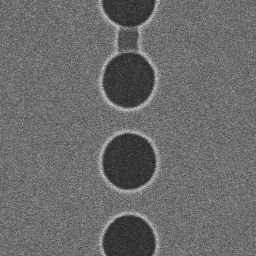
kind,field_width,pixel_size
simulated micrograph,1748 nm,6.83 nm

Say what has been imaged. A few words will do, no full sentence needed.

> holes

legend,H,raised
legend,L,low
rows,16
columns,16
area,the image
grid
HHHHHHLLLLHHHHHH
HHHHHHHLLHHHHHHH
HHHHHHHHHHHHHHHH
HHHHHHHLLHHHHHHH
HHHHHHLLLLHHHHHH
HHHHHHLLLLHHHHHH
HHHHHHHLLHHHHHHH
HHHHHHHHHHHHHHHH
HHHHHHHLLHHHHHHH
HHHHHHLLLLHHHHHH
HHHHHHLLLLHHHHHH
HHHHHHHLLHHHHHHH
HHHHHHHHHHHHHHHH
HHHHHHHHHHHHHHHH
HHHHHHHLLLHHHHHH
HHHHHHLLLLHHHHHH